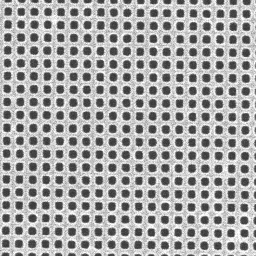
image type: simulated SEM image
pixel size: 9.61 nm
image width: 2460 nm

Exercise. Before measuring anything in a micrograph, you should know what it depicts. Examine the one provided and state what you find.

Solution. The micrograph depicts a regular array of holes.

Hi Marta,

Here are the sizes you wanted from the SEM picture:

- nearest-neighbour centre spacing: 123 nm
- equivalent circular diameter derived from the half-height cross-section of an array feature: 88.8 nm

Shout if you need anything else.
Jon